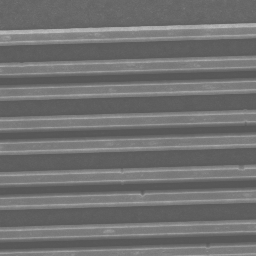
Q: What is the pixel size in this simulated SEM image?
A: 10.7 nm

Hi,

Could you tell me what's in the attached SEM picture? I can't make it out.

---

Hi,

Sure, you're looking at parallel lines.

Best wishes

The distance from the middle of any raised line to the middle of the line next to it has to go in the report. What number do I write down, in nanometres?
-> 300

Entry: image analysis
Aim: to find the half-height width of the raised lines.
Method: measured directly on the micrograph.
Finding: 126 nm